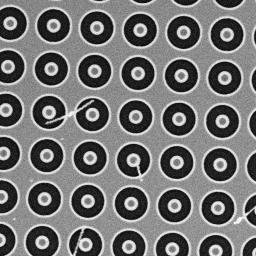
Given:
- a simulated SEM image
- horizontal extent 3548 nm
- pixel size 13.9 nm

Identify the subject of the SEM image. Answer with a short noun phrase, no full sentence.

an array of small figures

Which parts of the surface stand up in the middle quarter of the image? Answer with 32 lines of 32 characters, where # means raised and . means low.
.###...#....###.......####......
.##...###...##....#....##.......
.##....##...##...###...##...##..
.###........##....#....##...##..
####.......####.......###.......
#####.....######.....#####......
#################...#######.....
################################
######..########################
####......######....########.###
###........####......#####.....#
.##...##...###........###.......
.##...##....##...##...###.......
###...##...###...##...##...###..
###........###........###...##..
####......####........###.......
#####....######......#####......
##################.########....#
################################
#####...########################
###.......#####.....#######..###
###.......####.......####......#
##....#....##.........##........
##...###...##...###...##....#...
##....#....##...###...##...###..
###.......###.....#..###...##...
###.......####.......###........
#####...#######.....#####.......
##########################....##
################################
####....########################
###......#####......######...###